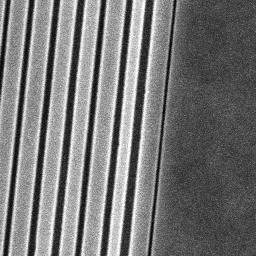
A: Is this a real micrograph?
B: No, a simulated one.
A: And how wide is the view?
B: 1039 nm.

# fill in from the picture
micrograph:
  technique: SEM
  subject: parallel lines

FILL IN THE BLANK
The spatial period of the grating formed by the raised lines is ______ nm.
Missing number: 97.5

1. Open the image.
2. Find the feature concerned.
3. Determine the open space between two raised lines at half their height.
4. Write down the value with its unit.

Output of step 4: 7.71 pixels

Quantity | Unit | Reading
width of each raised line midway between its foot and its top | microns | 0.0692